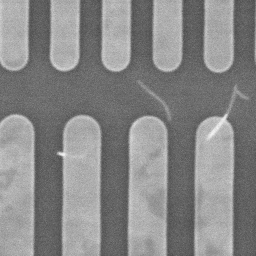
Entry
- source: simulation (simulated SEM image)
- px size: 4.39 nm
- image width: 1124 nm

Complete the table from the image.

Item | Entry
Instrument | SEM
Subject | groups of lines, slits or small figures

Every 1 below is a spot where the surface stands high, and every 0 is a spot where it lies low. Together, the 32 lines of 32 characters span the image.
11110011110001110001111000111000
11110011110001110001111000111000
11110011110001110001111000111000
11100011110001110001111000111000
11100011110001110001111000111000
11100011110001110001111000111000
11100011110001110001111000111000
11100011110001110001111000111000
01100001100001110000110000111000
00000000000000000000000000000000
00000000000000000000000000000000
00000000000000000000000000000000
00000000000000000000000000000000
00000000000000000000000000000000
01100000000000000000000000000000
11110000111100000111000001111000
11110000111110001111100001111000
11110000111110001111100001111000
11110000111110001111100011111000
11110000111110001111100011111000
11110000111100001111100011111000
11110000111100001111100011111000
11110000111100001111100011111000
11110000111100001111100011111000
11110000111100001111100011111000
11110000111100001111100011111000
11110000111100001111100011111000
11110000111100001111100011111000
11110000111100001111100011111000
11110000111100001111100011111000
11110000111100001111100011111000
11110000111100001111100011111000